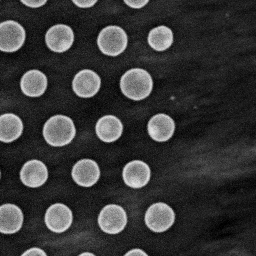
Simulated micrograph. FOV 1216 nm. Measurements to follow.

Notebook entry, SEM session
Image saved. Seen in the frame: a regular array of raised bodies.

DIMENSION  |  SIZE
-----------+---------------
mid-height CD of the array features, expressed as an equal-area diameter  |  26.7 px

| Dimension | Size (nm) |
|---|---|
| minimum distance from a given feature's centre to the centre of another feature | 237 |